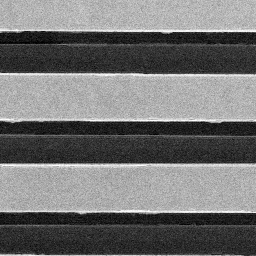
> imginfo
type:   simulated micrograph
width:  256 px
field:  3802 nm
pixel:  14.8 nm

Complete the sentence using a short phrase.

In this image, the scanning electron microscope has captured lines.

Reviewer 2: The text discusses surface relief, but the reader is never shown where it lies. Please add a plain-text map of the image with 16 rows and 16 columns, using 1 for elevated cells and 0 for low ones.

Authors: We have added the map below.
1111111111111111
1111111111111111
0000000000000000
0000000000000000
0000000000000000
1111111111111111
1111111111111111
0000011111111111
0000000000000000
0000000000000000
1111111111111111
1111111111111111
1111111111111111
0000000000000000
0000000000000000
0000000000000000